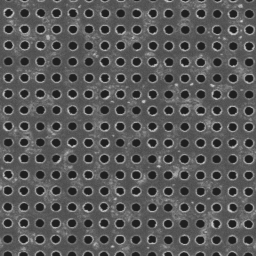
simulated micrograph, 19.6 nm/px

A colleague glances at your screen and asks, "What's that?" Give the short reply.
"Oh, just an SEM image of a regular array of holes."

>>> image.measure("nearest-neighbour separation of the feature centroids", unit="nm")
308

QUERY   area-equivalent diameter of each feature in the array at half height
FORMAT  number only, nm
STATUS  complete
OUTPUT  163